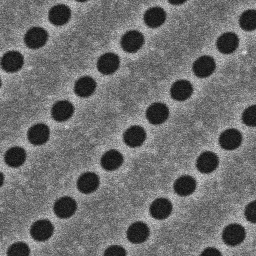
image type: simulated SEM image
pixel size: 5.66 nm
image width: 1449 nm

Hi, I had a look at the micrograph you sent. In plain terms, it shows a regular array of holes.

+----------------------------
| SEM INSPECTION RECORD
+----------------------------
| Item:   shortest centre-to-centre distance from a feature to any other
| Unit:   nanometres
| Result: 185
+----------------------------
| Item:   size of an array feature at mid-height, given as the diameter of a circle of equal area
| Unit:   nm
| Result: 131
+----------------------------